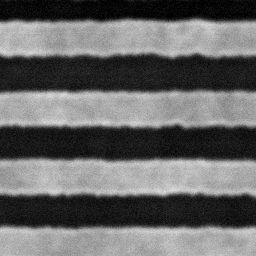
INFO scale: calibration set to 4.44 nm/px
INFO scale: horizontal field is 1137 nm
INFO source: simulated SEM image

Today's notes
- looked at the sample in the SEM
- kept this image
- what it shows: lines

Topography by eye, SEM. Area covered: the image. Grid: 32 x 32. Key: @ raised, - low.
--------------------------------
--------------------------------
----------------@-------@-------
@@@@@@@@@@@@@@@@@@@@@@@@@@@@@@@@
@@@@@@@@@@@@@@@@@@@@@@@@@@@@@@@@
@@@@@@@@@@@@@@@@@@@@@@@@@@@@@@@@
@@@@@@@@@@@@@@@@@@@@@@@@@@@@@@@@
--------------------------------
--------------------------------
--------------------------------
--------------------------------
----------@@@--------@@-@@@--@@-
@@@@@@@@@@@@@@@@@@@@@@@@@@@@@@@@
@@@@@@@@@@@@@@@@@@@@@@@@@@@@@@@@
@@@@@@@@@@@@@@@@@@@@@@@@@@@@@@@@
@@@@@@@@@@@@@@@@@@@@@@@@@@@@@@@@
--------------------------------
--------------------------------
--------------------------------
--------------------------------
@@@@@@@@@@@@@@@@@@@@@@@@@@@@@@@@
@@@@@@@@@@@@@@@@@@@@@@@@@@@@@@@@
@@@@@@@@@@@@@@@@@@@@@@@@@@@@@@@@
@@@@@@@@@@@@@@@@@@@@@@@@@@@@@@@@
--------------------------------
--------------------------------
--------------------------------
--------------------------------
@@@@-@@@--@@@@-@@@@-@-@@-@@@--@@
@@@@@@@@@@@@@@@@@@@@@@@@@@@@@@@@
@@@@@@@@@@@@@@@@@@@@@@@@@@@@@@@@
@@@@@@@@@@@@@@@@@@@@@@@@@@@@@@@@